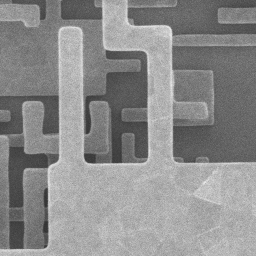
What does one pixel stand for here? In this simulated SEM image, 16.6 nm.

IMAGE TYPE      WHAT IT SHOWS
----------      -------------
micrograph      wiring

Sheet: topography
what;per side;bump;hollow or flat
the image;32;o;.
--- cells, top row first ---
.............ooo................
ooooo........ooo................
ooooo........ooo................
........oo...oooooooo...........
.......ooo...oooooooo...........
.......ooo...oooooooo...........
.......ooo........ooo...........
.......ooo........ooo...........
.......ooo.........ooo..........
.......ooo.........ooo..........
.......ooo.........ooo..........
.......ooo.........ooo..........
.......ooo.........ooo..........
...oo..ooo.ooo.....ooooooo......
...oo..ooo.ooo.....ooooooo......
...oo..ooo.ooo.....ooo..........
...oo..ooooooo.....ooo..........
o..ooooooooooo.....ooo..........
o..ooooooooooo.....ooo..........
o......oooo........ooo..........
o......ooooo.....ooooooooooooooo
o..ooooooooooooooooooooooooooooo
o..ooooooooooooooooooooooooooooo
o..ooooooooooooooooooooooooooooo
o..oo.oooooooooooooooooooooooooo
o..oo.oooooooooooooooooooooooooo
o..ooooooooooooooooooooooooooooo
o..ooooooooooooooooooooooooooooo
o..oo.oooooooooooooooooooooooooo
o..oo.oooooooooooooooooooooooooo
o..ooooooooooooooooooooooooooooo
oooooooooooooooooooooooooooooooo